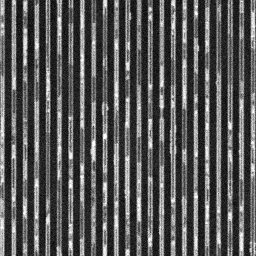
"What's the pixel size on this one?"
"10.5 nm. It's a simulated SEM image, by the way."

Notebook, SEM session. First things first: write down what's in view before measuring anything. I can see parallel lines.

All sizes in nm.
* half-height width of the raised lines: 40.7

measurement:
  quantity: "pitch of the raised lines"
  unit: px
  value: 11.4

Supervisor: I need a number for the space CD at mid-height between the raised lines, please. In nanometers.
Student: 82.7